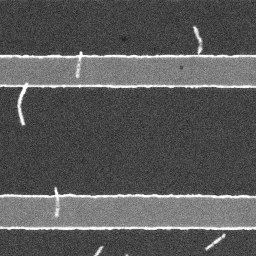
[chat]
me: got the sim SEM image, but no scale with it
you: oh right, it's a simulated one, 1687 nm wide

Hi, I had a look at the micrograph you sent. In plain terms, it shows lines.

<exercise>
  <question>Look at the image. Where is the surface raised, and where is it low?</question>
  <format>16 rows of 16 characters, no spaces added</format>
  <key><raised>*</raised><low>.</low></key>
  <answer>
................
................
................
**.*************
****************
................
................
................
................
................
................
................
****************
****************
................
................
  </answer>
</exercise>